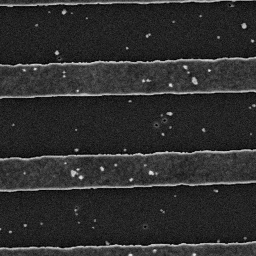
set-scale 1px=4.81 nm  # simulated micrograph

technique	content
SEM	lines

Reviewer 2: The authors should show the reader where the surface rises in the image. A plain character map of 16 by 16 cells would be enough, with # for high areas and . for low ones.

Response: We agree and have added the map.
................
................
................
................
################
################
................
................
................
..........#.####
################
#############...
................
................
................
.##.############